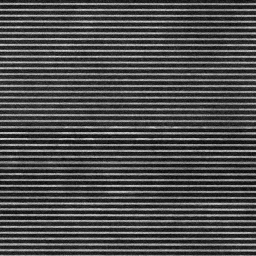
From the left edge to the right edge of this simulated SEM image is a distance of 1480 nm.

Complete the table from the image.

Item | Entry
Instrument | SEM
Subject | parallel lines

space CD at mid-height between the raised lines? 23.1 nm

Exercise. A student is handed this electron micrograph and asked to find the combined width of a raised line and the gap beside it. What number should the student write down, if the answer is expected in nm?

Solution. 34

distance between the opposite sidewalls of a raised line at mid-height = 10.8 nm